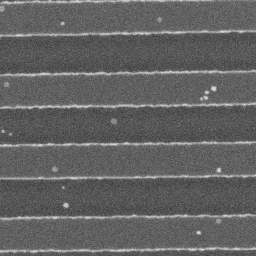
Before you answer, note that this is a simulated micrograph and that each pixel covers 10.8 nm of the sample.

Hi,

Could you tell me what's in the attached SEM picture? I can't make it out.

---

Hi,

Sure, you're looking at lines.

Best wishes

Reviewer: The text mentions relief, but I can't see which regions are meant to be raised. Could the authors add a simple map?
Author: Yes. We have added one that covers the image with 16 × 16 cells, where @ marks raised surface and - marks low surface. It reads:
@@@@@@@@@@@@@@@@
@@@@@@@@@@@@@@@@
----------------
----------------
----------@@@@@@
@@@@@@@@@@@@@@@@
@@@@@@@@@@@@@@@@
----------------
----------------
@@@@@@@@@@@@@@@@
@@@@@@@@@@@@@@@@
----------------
----------------
--------@-@@@@@@
@@@@@@@@@@@@@@@@
@@@@@@@@@@@@@@@@